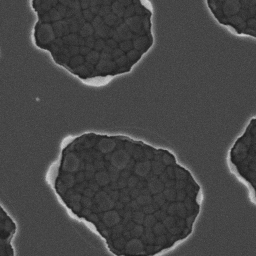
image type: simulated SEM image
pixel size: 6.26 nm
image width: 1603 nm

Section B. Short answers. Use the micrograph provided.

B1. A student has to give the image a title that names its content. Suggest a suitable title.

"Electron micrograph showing holes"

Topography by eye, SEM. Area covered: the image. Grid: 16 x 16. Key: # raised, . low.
##.......####...
##.......#####..
##........######
###......#######
####....########
################
################
################
#####...#######.
####.......###..
###........###..
###.........###.
####.........###
.####.......####
.#####......####
.######....#####